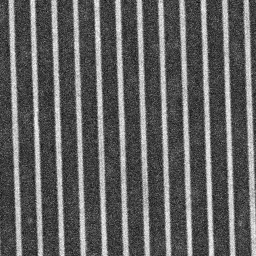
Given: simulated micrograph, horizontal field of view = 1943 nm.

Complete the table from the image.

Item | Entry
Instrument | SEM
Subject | parallel lines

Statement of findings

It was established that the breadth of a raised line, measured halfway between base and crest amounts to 0.0285 um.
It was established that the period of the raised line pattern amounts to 162 nanometers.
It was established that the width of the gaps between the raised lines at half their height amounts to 136 nm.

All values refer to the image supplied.